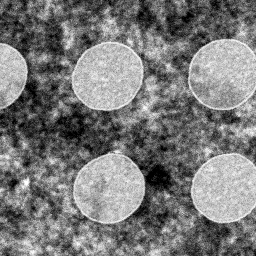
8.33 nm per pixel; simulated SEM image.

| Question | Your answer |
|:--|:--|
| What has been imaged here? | raised bodies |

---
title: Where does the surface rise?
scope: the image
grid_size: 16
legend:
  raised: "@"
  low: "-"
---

----------------
----------------
--------------@-
@----@@@@---@@@@
@@---@@@@---@@@@
@----@@@@---@@@@
@----@@@-----@@-
----------------
----------------
----------------
-----@@@@----@@@
-----@@@@---@@@@
-----@@@@---@@@@
-----@@@-----@@-
----------------
----------------